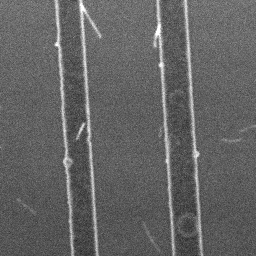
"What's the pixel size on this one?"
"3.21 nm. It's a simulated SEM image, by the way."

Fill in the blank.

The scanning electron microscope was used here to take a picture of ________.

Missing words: one or a few lines or trenches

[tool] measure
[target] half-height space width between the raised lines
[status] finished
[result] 0.242 microns